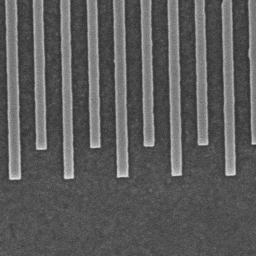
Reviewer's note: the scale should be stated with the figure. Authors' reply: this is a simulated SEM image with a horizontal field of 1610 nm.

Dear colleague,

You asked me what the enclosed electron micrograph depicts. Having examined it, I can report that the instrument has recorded parallel lines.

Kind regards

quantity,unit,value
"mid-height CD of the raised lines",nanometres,60.6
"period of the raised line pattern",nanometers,170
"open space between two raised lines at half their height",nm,109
